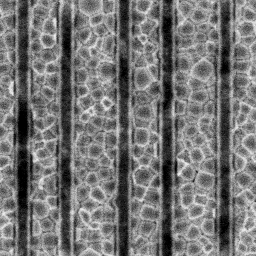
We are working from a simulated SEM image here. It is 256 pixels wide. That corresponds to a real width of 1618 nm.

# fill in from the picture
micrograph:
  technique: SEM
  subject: parallel lines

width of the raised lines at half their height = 83.8 nm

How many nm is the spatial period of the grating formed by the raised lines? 320